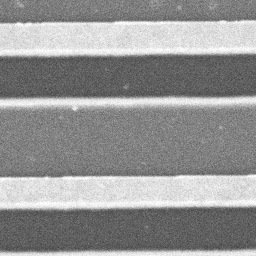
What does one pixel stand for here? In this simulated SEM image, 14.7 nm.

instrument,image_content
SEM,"lines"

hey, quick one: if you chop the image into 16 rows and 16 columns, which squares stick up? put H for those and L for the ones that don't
HHHHHHHHHHHHHHHH
HHHHHHHHHHHHHHHH
HHHHHHHHHHHHHHHH
LLLLLLLLLLLLLLLL
LLLLLLLLLLLLLLLL
LLLLLLLLLLLLLLLL
HHHHHHHHHHHHHHHH
HHHHHHHHHHHHHHHH
HHHHHHHHHHHHHHHH
HHHHHHHHHHHHHHHH
HHHHHHHHHHHHHHHH
HHHHHHHHHHHHHHHH
HHHHHHHHHHHHHHHH
LLLLLLLLLLLLLLLL
LLLLLLLLLLLLLLLL
LLLLLLLLLLLLLLLL